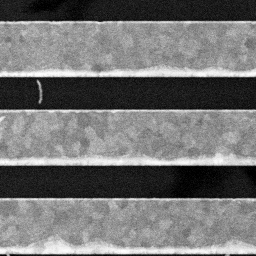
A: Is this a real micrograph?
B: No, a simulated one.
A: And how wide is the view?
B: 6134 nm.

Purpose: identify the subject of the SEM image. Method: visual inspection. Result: lines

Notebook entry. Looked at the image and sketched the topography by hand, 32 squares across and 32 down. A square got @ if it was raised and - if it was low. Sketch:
--------------------------------
--------------------------------
--------------------------------
@@@@@@@@@@@@@@@@@@@@@@@@@@@@@@@@
@@@@@@@@@@@@@@@@@@@@@@@@@@@@@@@@
@@@@@@@@@@@@@@@@@@@@@@@@@@@@@@@@
@@@@@@@@@@@@@@@@@@@@@@@@@@@@@@@@
@@@@@@@@@@@@@@@@@@@@@@@@@@@@@@@@
@@@@@@@@@@@@@@@@@@@@@@@@@@@@@@@@
--------------------------------
--------------------------------
--------------------------------
--------------------------------
--------------------------------
@@@@@@@@@@@@@@@@@@@@@@@@@@@@@@@@
@@@@@@@@@@@@@@@@@@@@@@@@@@@@@@@@
@@@@@@@@@@@@@@@@@@@@@@@@@@@@@@@@
@@@@@@@@@@@@@@@@@@@@@@@@@@@@@@@@
@@@@@@@@@@@@@@@@@@@@@@@@@@@@@@@@
@@@@@@@@@@@@@@@@@@@@@@@@@@@@@@@@
--------------------------------
--------------------------------
--------------------------------
--------------------------------
--------------------------------
@@@@@@@@@@@@@@@@@@@@@@@@@@@@@@@@
@@@@@@@@@@@@@@@@@@@@@@@@@@@@@@@@
@@@@@@@@@@@@@@@@@@@@@@@@@@@@@@@@
@@@@@@@@@@@@@@@@@@@@@@@@@@@@@@@@
@@@@@@@@@@@@@@@@@@@@@@@@@@@@@@@@
@@@@@@@@@@@@@@@@@@@@@@@@@@@@@@@@
@@@@@---@@@--@@@@@@@@@@@@@@@@-@@